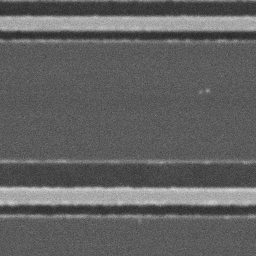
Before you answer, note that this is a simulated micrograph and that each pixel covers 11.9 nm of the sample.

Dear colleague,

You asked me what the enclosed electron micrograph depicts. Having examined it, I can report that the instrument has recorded lines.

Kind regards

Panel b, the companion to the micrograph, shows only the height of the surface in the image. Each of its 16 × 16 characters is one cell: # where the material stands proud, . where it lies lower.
................
................
................
################
################
################
################
################
################
################
................
................
................
#############..#
################
################